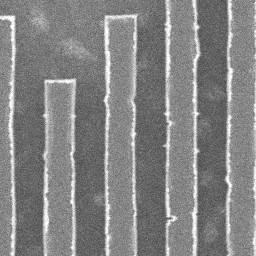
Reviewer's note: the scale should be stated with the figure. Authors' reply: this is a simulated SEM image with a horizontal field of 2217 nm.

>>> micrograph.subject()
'parallel lines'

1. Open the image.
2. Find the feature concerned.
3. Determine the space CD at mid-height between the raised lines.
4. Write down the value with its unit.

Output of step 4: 268 nanometres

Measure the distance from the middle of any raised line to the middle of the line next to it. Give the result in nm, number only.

528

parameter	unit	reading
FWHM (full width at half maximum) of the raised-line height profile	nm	253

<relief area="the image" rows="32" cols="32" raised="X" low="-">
---------------------XXX-----XXX
---------------------XXX-----XXX
XX-----------XXXX----XXX-----XXX
XX-----------XXXX----XXXX----XXX
XX-----------XXXX----XXXX----XXX
XX-----------XXXX----XXXX---XXXX
XX-----------XXXX----XXXX---XXXX
XX-----------XXXX----XXXX---XXXX
XX-----------XXXX----XXX----XXXX
XX-----------XXXX----XXX----XXXX
XX----XXX----XXXX----XXX----XXXX
XX----XXX----XXXX----XXX----XXXX
XX----XXX----XXXX----XXX-----XXX
XX----XXX----XXXX----XXX-----XXX
X-----XXX----XXXX----XXXX---XXXX
X-----XXX----XXXX----XXX----XXXX
XX----XXX----XXXX----XXX----XXXX
XX----XXX----XXXX----XXX----XXXX
XX----XXX----XXXX----XXXX---XXXX
XX---XXXX----XXXX----XXXX---XXXX
XX----XXX----XXXX----XXX----XXXX
XX----XXX----XXXX----XXX----XXXX
XX----XXX----XXXX----XXXX---XXXX
XX----XXX----XXXX----XXX-----XXX
XX----XXX----XXXX----XXXX---XXXX
XX----XXX----XXXX----XXXX---XXXX
XX----XXX----XXXX----XXXX---XXXX
XX----XXX----XXXX----XXXX---XXXX
XX----XXX----XXXX----XXXX---XXXX
XX----XXX----XXXX----XXXX---XXXX
XX----XXX----XXXX----XXXX----XXX
XX----XXX----XXXX----XXXX----XXX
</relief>